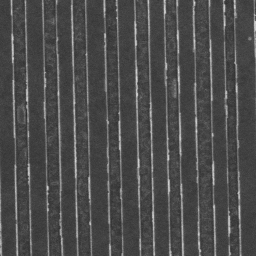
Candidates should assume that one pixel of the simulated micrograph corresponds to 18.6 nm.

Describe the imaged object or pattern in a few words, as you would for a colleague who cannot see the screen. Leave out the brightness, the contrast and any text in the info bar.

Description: parallel lines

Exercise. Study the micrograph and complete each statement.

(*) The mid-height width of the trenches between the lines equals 228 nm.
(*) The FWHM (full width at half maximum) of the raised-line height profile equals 325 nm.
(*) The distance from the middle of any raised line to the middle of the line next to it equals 0.565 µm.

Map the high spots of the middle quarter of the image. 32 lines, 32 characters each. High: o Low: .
oo....ooooo...oooo...ooooo...ooo
oo....ooooo...oooo....oooo...ooo
oo....oooo....oooo....ooo....ooo
oo....oooo....oooo....oooo...ooo
oo....oooo....oooo....oooo...ooo
oo....oooo....oooo....oooo...ooo
oo....oooo....oooo....oooo...ooo
ooo...ooooo...oooo....oooo...ooo
ooo...ooooo...oooo....oooo...ooo
ooo...ooooo...oooo....oooo...ooo
oo....ooooo...oooo....oooo...ooo
ooo...ooooo...oooo....oooo...ooo
ooo...ooooo...oooo....oooo...ooo
ooo...ooooo...oooo....oooo...ooo
ooo...ooooo...oooo....oooo...ooo
ooo...ooooo...oooo....oooo...ooo
ooo...ooooo...oooo....oooo...ooo
ooo...ooooo...oooo....oooo...ooo
ooo...ooooo...oooo....oooo...ooo
ooo...ooooo...oooo....oooo...ooo
ooo...ooooo...oooo....oooo...ooo
ooo...ooooo...oooo....oooo...ooo
ooo...ooooo...oooo....oooo...ooo
ooo...ooooo...ooooo...oooo...ooo
ooo...ooooo...ooooo...oooo...ooo
ooo...ooooo...ooooo...oooo...ooo
ooo...ooooo...ooooo...oooo...ooo
ooo...ooooo...ooooo...oooo...ooo
ooo...ooooo...ooooo...oooo...ooo
ooo...ooooo...ooooo...oooo...ooo
ooo...ooooo...ooooo...oooo...ooo
ooo...ooooo...ooooo...oooo...ooo